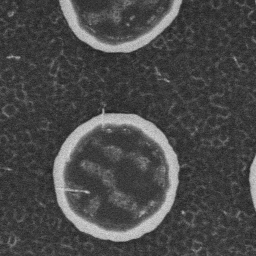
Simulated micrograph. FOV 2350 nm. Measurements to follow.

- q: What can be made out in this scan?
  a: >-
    raised bodies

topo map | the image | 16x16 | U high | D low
DDDDUUUUUUUDDDDD
DDDDDUUUUUDDDDDD
DDDDDDUUUDDDDDDD
DDDDDDDDDDDDDDDD
DDDDDDDDDDDDDDDD
DDDDDDDDDDDDDDDD
DDDDDDDDDDDDDDDD
DDDDDDUUDDDDDDDD
DDDDDUUUUUDDDDDD
DDDDUUUUUUUDDDDD
DDDDUUUUUUUDDDDD
DDDDUUUUUUUDDDDD
DDDDUUUUUUUDDDDD
DDDDDUUUUUDDDDDD
DDDDDDUUUDDDDDDD
DDDDDDDDDDDDDDDD